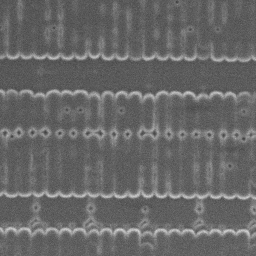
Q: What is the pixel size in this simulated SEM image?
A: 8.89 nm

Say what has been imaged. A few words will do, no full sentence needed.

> wiring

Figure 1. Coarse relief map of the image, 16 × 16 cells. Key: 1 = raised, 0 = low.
1111111111111111
1111111111111111
1111111111111111
1111111111111111
0000000000000000
0000000000000000
1111111111111111
1111111111111111
1111111111111111
1111111111111111
1111111111111111
1111111111111111
0000000000000000
0000000000000000
1111111111111111
1111111111111111